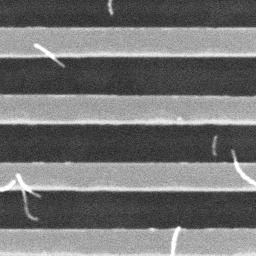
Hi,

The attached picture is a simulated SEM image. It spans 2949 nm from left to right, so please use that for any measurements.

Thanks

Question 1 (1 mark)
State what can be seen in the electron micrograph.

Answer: lines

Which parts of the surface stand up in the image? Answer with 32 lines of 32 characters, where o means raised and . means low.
................................
................................
................................
o..ooo..........................
oooooooooooooooooooooooooooooooo
oooooooooooooooooooooooooooooooo
oooooooooooooooooooooooooooooooo
................................
................................
................................
................................
................................
oooooooooooooooooooooooooooooooo
oooooooooooooooooooooooooooooooo
oooooooooooooooooooooooooooooooo
......................o......ooo
................................
................................
................................
................................
oooooooooooooooooooooooooooooooo
oooooooooooooooooooooooooooooooo
oooooooooooooooooooooooooooooooo
oooooooooooooooooooooooooooooooo
................................
................................
................................
................................
................................
oooooooooooooooooooooooooooooooo
oooooooooooooooooooooooooooooooo
oooooooooooooooooooooooooooooooo